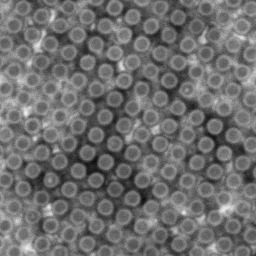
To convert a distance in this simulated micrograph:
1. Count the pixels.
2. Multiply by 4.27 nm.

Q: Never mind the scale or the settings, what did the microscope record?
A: a regular array of raised bodies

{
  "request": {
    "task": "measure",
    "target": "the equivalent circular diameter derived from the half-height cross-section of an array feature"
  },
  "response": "60.3 nanometers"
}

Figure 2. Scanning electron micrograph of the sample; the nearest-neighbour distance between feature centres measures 20 pixels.